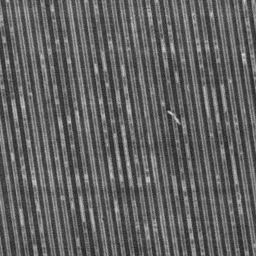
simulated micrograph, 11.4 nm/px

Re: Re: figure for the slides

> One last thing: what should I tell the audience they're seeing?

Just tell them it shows parallel lines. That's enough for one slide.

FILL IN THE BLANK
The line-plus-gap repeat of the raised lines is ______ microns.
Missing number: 0.0992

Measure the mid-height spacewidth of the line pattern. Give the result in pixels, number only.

4.82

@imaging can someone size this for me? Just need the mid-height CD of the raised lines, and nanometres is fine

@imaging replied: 45.2